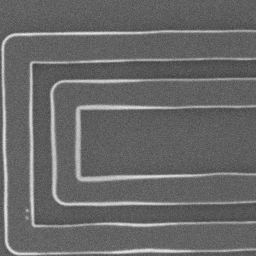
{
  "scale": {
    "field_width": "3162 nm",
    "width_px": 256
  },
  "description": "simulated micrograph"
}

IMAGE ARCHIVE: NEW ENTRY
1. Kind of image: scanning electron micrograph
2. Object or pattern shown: groups of lines, slits or small figures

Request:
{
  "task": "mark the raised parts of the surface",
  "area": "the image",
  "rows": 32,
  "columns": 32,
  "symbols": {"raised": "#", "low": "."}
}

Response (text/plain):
................................
................................
................................
................................
.###############################
################################
################################
################................
####............................
####............................
####...#########################
####..##########################
.###..##########################
.###...###......................
.###...###......................
.###...###......................
.###...###......................
.###...###......................
.###...###......................
.###...###......................
.###...###......................
.###...###......................
.###...#########################
.###...#########################
.###...#########################
.###....######.....####.........
.###............................
.###............................
.###############################
.###############################
.###############################
..#############.................